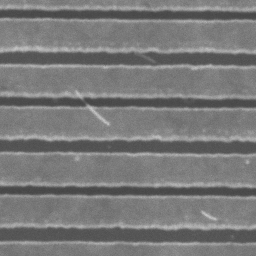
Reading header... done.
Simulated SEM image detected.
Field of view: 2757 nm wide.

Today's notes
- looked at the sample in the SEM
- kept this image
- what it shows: lines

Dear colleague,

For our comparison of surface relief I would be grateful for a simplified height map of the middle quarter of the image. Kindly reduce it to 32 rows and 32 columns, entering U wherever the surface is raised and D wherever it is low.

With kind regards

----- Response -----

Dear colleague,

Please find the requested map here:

UUUUUUUUUUUUUUUUUUUDUUDUUUUUUUUU
UUUUUUUUUUUUUUUUUUUUUUUUUUUUUUUU
UUUUUUUUUUUUUUUUUUUUUUUUUUUUUUUU
UUUUUUUUUUUUUUUUUUUUUUUUUUUUUUUU
UUUUUUUUUUUUUUUUUUUUUUUUUUUUUUUU
UUUUUUUUUUUUUUUUUUUUUUUUUUUUUUUU
UUUUUUUUUUUUUUUUUUUUUUUUUUUUUUUU
UUUUUUUUUUUUUUUUUUUUUUUUUUUUUUUU
DDUUUDUUDDDDDDUUUUUUUUUDDUDDDUUD
DDDDDDDDDDDDDDDDDDDDDDDDDDDDDDDD
DDDDDUUDDDDDDDDDDDDDDDDDDDDDDDDD
UUUUUUUUUUUUUUUUUUUUUUUUUUUUUUUU
UUUUUUUUUUUUUUUUUUUUUUUUUUUUUUUU
UUUUUUUUUUUUUUUUUUUUUUUUUUUUUUUU
UUUUUUUUUUUUUUUUUUUUUUUUUUUUUUUU
UUUUUUUUUUUUUUUUUUUUUUUUUUUUUUUU
UUUUUUUUUUUUUUUUUUUUUUUUUUUUUUUU
UUUUUUUUUUUUUUUUUUUUUUUUUUUUUUUU
UUUUUUUUUUUUUUUUUUUUUUUUUUUUUUUU
DDDDDDDDDDDDDDDDDDDDDDDDDDDDDDDD
DDDDDDDDDDDDDDDDDDDDDDDDDDDDDDDD
DDDDDDDDDDDDDDDDDDDDDDDDDDDDDDDD
UUUUUUUUUUUUUUUUUDUUUUUUDDDUDDDD
UUUUUUUUUUUUUUUUUUUUUUUUUUUUUUUU
UUUUUUUUUUUUUUUUUUUUUUUUUUUUUUUU
UUUUUUUUUUUUUUUUUUUUUUUUUUUUUUUU
UUUUUUUUUUUUUUUUUUUUUUUUUUUUUUUU
UUUUUUUUUUUUUUUUUUUUUUUUUUUUUUUU
UUUUUUUUUUUUUUUUUUUUUUUUUUUUUUUU
UUUUUUUUUUUUUUUUUUUUUUUUUUUUUUUU
UDDUUUDDDDUUUUDDDUUUUUUUUUUUUUUU
DDDDDDDDDDDDDDDDDDDDDDDDDDDDDDDD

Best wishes